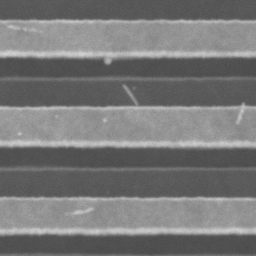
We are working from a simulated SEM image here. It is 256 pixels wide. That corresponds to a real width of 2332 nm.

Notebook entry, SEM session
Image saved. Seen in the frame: lines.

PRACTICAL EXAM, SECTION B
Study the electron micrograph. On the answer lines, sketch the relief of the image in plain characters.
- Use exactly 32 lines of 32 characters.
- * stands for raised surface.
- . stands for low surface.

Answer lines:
................................
................................
................................
********************************
********************************
********************************
********************************
................................
................................
................................
................................
................................
................................
********************************
********************************
********************************
********************************
********************************
................................
................................
................................
................................
................................
................................
................................
********************************
********************************
********************************
********************************
................................
................................
................................